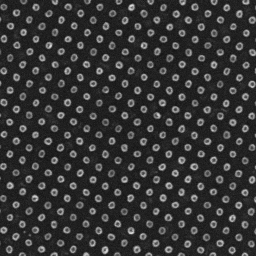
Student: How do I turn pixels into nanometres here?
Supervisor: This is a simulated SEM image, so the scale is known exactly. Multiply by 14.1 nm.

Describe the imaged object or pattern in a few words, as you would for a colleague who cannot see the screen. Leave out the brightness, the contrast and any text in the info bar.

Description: a regular array of raised bodies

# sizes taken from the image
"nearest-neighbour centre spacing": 194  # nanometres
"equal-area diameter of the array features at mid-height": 88.3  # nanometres